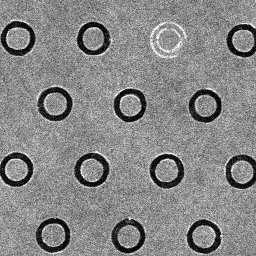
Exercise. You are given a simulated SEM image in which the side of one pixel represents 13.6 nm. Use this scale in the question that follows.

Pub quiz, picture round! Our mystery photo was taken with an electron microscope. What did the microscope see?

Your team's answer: a regular array of ring-shaped grooves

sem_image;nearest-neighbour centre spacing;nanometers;1020